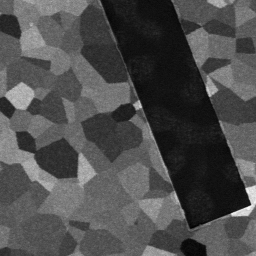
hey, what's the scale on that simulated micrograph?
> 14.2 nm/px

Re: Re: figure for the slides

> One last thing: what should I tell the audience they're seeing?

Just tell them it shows one or a few lines or trenches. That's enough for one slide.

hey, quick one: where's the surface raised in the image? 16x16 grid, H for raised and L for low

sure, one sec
HHHHHHLLLLLHHHHH
HHHHHHHLLLLHHHHH
HHHHHHHLLLLLHHHH
HHHHHHHHLLLLHHHH
HHHHHHHHLLLLLHHH
HHHHHHHHLLLLLHHH
HHHHHHHHHLLLLHHH
HHHHHHHHHLLLLLHH
HHHHHHHHHHLLLLHH
HHHHHHHHHHLLLLHH
HHHHHHHHHHLLLLLH
HHHHHHHHHHHLLLLH
HHHHHHHHHHHLLLLL
HHHHHHHHHHHHLLHH
HHHHHHHHHHHHHHHH
HHHHHHHHHHHHHHHH